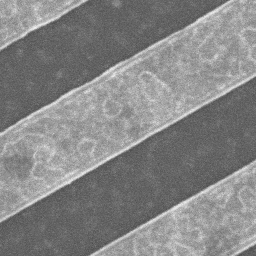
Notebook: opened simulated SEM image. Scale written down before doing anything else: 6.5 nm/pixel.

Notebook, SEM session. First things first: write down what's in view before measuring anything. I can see one or a few lines or trenches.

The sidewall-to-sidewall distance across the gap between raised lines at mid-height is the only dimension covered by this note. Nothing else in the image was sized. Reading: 486 nm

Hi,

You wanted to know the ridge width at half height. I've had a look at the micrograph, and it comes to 0.491 microns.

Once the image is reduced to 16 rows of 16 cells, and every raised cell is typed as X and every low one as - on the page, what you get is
XXXXX---------XX
XXX---------XXXX
X---------XXXXXX
--------XXXXXXXX
-------XXXXXXXXX
-----XXXXXXXXXX-
---XXXXXXXXXX---
-XXXXXXXXXX-----
XXXXXXXXX-------
XXXXXXXX--------
XXXXXX---------X
XXXX----------XX
XX----------XXXX
X---------XXXXXX
--------XXXXXXXX
------XXXXXXXXX-